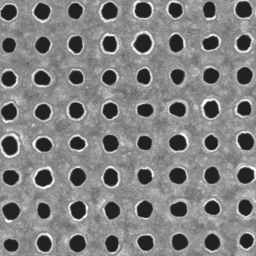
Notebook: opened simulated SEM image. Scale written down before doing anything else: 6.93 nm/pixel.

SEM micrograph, a regular array of holes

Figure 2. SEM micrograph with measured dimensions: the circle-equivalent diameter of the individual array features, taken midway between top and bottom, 109 nanometres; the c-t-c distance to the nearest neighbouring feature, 227 nm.